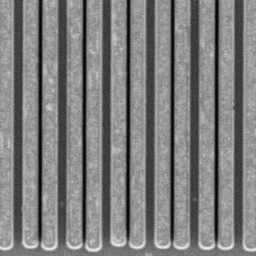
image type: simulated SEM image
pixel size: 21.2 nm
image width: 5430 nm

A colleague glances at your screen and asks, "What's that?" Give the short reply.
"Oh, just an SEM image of parallel lines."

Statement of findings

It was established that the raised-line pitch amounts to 459 nm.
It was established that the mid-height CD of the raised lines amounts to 316 nanometers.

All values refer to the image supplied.